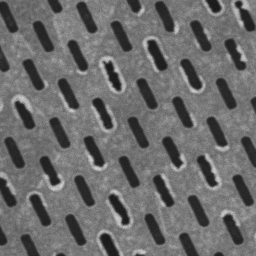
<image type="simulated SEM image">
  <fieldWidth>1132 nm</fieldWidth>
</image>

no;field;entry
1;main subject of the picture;a regular array of holes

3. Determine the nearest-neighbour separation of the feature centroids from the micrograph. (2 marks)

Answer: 173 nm